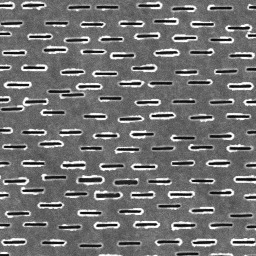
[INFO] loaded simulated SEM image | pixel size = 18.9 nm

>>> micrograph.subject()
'a regular array of holes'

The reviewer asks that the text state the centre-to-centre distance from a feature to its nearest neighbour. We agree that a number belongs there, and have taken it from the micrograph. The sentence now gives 410 nm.